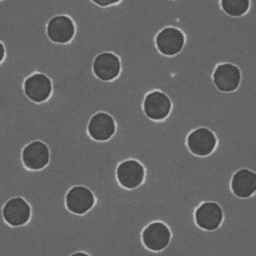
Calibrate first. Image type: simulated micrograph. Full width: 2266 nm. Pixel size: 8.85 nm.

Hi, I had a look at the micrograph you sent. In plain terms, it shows a regular array of holes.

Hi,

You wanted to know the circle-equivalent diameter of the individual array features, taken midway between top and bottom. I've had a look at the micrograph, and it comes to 247 nm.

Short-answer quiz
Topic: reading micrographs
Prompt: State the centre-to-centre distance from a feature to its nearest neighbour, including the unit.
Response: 516 nanometres